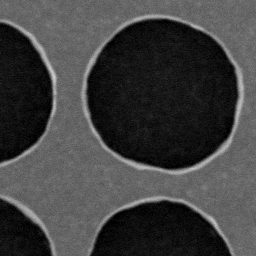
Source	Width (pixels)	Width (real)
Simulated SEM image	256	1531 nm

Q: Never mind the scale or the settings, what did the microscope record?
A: holes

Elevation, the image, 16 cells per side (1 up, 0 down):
1111111111111111
1111111100001111
0011111000000111
0001110000000011
0001110000000001
0001100000000001
0001100000000001
0001110000000001
0001110000000011
0011111000000011
1111111111001111
1111111111111111
1111111111111111
0011111000000111
0001110000000011
0001110000000011